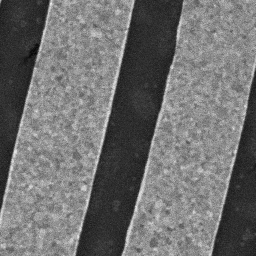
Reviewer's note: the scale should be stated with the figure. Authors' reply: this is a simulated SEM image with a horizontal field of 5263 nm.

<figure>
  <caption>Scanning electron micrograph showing one or a few lines or trenches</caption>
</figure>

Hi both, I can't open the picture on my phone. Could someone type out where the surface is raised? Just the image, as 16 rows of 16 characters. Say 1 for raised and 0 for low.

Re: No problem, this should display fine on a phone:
0001111100011111
0001111100011111
0001111100011111
0011111100011111
0011111000011111
0011111000111111
0011111000111110
0111111000111110
0111110000111110
0111110001111110
0111110001111100
1111110001111100
1111110001111100
1111100011111100
1111100011111000
1111100011111000